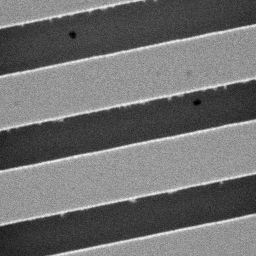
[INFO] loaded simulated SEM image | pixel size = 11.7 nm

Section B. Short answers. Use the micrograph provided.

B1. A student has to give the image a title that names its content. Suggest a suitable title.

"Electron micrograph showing lines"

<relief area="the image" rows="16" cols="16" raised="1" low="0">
1111110000000000
1000000000000000
0000000000011111
0000001111111111
0111111111111111
1111111111111000
1111111100000000
1110000000000000
0000000000011111
0000001111111111
0111111111111111
1111111111111000
1111111100000000
1110000000000001
0000000000011111
0000001111111111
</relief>